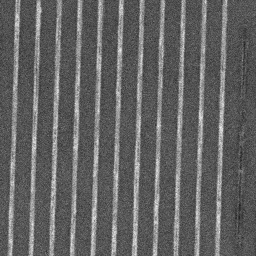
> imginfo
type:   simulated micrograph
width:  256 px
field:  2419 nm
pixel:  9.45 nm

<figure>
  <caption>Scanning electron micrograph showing parallel lines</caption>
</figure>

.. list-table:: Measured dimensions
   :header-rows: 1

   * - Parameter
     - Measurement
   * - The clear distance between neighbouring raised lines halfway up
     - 158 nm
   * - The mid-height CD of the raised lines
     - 39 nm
